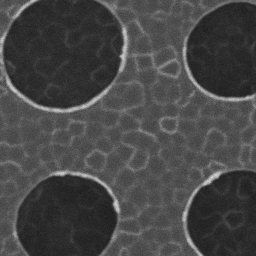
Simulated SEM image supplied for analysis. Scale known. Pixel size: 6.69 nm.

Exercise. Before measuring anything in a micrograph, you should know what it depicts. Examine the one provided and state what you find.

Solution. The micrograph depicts holes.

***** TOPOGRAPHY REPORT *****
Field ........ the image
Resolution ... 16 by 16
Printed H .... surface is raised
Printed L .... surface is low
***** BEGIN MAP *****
HHLLLLLHHHHHHHLL
HLLLLLLLHHHHLLLL
LLLLLLLLHHHHLLLL
LLLLLLLLHHHHLLLL
LLLLLLLHHHHHLLLL
HLLLLLLHHHHHHLLL
HHLLLHHHHHHHHHHH
HHHHHHHHHHHHHHHH
HHHHHHHHHHHHHHHH
HHHHHHHHHHHHHHHH
HHHHHHHHHHHHHHHH
HHLLLLHHHHHHHLLL
HLLLLLLHHHHHLLLL
HLLLLLLHHHHHLLLL
HLLLLLLHHHHHLLLL
HLLLLLLHHHHHLLLL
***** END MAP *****